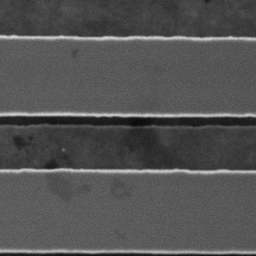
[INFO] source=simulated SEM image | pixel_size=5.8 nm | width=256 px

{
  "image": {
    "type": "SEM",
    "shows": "lines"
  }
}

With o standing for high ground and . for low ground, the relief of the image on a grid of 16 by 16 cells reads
................
................
oooooooooooooooo
oooooooooooooooo
oooooooooooooooo
oooooooooooooooo
oooooooooooooooo
................
................
................
................
oooooooooooooooo
oooooooooooooooo
oooooooooooooooo
oooooooooooooooo
oooooooooooooooo